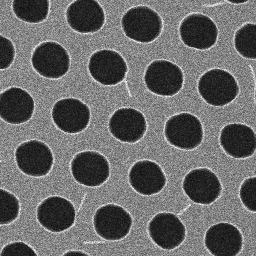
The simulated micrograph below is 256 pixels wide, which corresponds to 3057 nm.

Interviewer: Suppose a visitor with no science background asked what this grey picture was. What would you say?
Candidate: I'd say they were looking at a regular array of holes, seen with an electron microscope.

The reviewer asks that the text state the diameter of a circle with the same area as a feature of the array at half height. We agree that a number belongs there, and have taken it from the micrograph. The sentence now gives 35.8 pixels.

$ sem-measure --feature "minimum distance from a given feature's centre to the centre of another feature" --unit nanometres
663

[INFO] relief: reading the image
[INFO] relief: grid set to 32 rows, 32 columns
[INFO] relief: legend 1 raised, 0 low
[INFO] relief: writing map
11000011100011111111111111111111
11000011000001110001111111111111
11100111000001100000111000111111
11111111100011100000111000011100
11111111111111110000111000011000
01111001111111111111111000011000
00110000111100111111111111111100
00110000011000011111111111111111
01110000011000001110001111111111
11111101111100001100000110000111
11111111111110111100000110000011
10011111111111111110001110000011
00001111001111111111111111000111
00001110000111111111111111111111
00001110000111000011110011111111
11111110000111000011100001111111
11111111011111000011100001110000
11111111111111100111100001110000
11000011111111111111111011110000
11000011110001111111111111111001
11000011100001111001111111111111
11100011100000110000111100111111
11111111110001110000011000011110
11111111111111111000111000001100
00111111111111111111111100011100
00111000011111111111111111111110
00111000011100001111111111111111
00111000011100001110001111111111
11111100111100001110000111000111
11111111111110001110000111000011
10011111111111111111001111000011
00001111101111111111111111000011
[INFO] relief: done